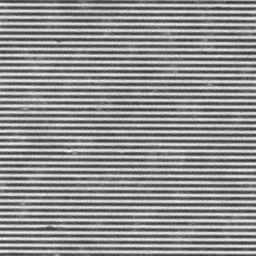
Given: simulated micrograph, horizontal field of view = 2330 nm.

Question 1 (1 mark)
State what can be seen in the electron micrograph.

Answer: parallel lines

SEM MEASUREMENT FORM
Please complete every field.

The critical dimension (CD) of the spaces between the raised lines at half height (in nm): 37.5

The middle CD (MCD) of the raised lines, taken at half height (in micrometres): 0.0216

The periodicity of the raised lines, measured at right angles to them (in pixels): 6.33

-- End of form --